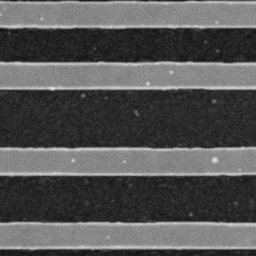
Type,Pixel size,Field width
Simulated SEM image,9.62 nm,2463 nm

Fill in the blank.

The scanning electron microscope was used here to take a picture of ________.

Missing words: lines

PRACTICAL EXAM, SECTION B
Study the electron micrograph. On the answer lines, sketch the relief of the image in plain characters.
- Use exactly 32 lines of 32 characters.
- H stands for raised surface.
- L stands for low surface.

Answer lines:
HHHHHHHHHHHHHHHHHHHHHHHHHHHHHHHH
HHHHHHHHHHHHHHHHHHHHHHHHHHHHHHHH
HHHHHHHHHHHHHHHHHHHHHHHHHHHHHHHH
LHLLLHHLHLLLHHHHLLLLLLLLLLLLLLLL
LLLLLLLLLLLLLLLLLLLLLLLLLLLLLLLL
LLLLLLLLLLLLLLLLLLLLLLLLLLLLLLLL
LLLLLLLLLLLLLLLLLLLLLLLLLLLLLLLL
LLLLLLLLLLLLLLLLLLLLLLLLLLLLLLLL
HHHHHHHHHHHHHHHHHHHHHHHHHHHHHHHH
HHHHHHHHHHHHHHHHHHHHHHHHHHHHHHHH
HHHHHHHHHHHHHHHHHHHHHHHHHHHHHHHH
LLLLLLLLLLLLLLLLLLLLLLLLLLLLLLLL
LLLLLLLLLLLLLLLLLLLLLLLLLLLLLLLL
LLLLLLLLLLLLLLLLLLLLLLLLLLLLLLLL
LLLLLLLLLLLLLLLLLLLLLLLLLLLLLLLL
LLLLLLLLLLLLLLLLLLLLLLLLLLLLLLLL
LLLLLLLLLLLLLLLLLLLLLLLLLLLLLLLL
LLLLLLLLLLLLLLLLLLLLLLLLLLLLLLLL
LLLLLLLLLLLLLLLLLLLLLLLLLLLLLLHH
HHHHHHHHHHHHHHHHHHHHHHHHHHHHHHHH
HHHHHHHHHHHHHHHHHHHHHHHHHHHHHHHH
HHHHHHHHHHHHHHHHHHHHHHHHHHHHHHHH
LLLLLLLLLLLLLLLLLLLLLLLLLLLLLLLL
LLLLLLLLLLLLLLLLLLLLLLLLLLLLLLLL
LLLLLLLLLLLLLLLLLLLLLLLLLLLLLLLL
LLLLLLLLLLLLLLLLLLLLLLLLLLLLLLLL
LLLLLLLLLLLLLLLLLLLLLLLLLLLLLLLL
LLLLLLLLLLLLLLLLLLLLLLLLLLLLLLLL
HHHHHHHHHHHHHHHHHHHHHHHHHHHHHHHH
HHHHHHHHHHHHHHHHHHHHHHHHHHHHHHHH
HHHHHHHHHHHHHHHHHHHHHHHHHHHHHHHH
LLLLLLLLLLLLLLLLLLLLLLLLLLLLLLLL